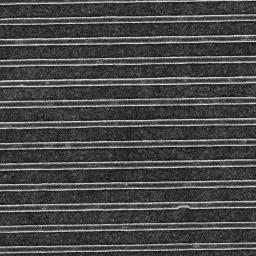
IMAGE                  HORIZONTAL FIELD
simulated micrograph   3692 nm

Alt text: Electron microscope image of parallel lines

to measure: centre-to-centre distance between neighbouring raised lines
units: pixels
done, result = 20.7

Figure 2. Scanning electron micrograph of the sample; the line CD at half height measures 0.0847 microns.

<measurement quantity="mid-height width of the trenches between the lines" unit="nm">207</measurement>